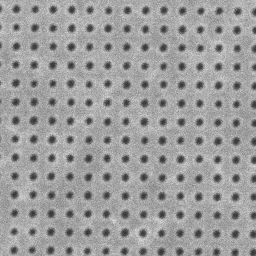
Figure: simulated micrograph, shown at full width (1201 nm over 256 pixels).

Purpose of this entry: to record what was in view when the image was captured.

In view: a regular array of holes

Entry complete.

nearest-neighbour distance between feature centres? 0.085 microns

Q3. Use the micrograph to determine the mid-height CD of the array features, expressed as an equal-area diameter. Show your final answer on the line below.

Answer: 37.8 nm